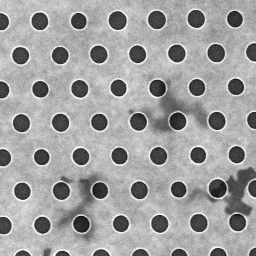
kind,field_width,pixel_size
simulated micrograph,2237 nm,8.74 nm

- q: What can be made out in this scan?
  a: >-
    a regular array of holes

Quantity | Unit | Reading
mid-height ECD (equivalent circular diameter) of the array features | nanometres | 152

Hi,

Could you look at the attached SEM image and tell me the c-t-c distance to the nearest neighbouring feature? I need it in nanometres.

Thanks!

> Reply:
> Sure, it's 339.